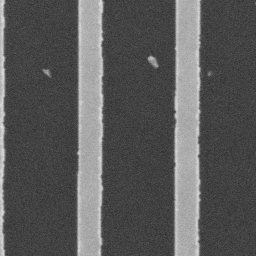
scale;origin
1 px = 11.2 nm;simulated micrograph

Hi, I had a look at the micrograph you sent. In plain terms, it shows lines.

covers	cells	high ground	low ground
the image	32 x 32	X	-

----------XXX---------XXX-------
----------XXX---------XXX-------
----------XXX---------XXX-------
----------XXX---------XXX-------
----------XXX---------XXX-------
----------XXX---------XXX-------
----------XXX---------XXX-------
----------XXX---------XXX-------
----------XXX---------XXX-------
----------XXX---------XXX-------
----------XXX---------XXX-------
----------XXX---------XXX-------
----------XXX---------XXX-------
----------XXX---------XXX-------
----------XXX---------XXX-------
----------XXX---------XXX-------
----------XXX---------XXX-------
----------XXX---------XXX-------
----------XXX---------XXX-------
----------XXX---------XXX-------
----------XXX---------XXX-------
----------XXX---------XXX-------
----------XXX---------XXX-------
----------XXX---------XXX-------
----------XXX---------XXX-------
----------XXX---------XXX-------
----------XXX---------XXX-------
----------XX----------XXX-------
----------XXX---------XXX-------
----------XXX---------XXX-------
----------XXX---------XXX-------
----------XXX---------XXX-------